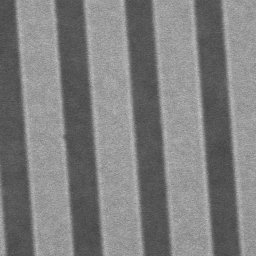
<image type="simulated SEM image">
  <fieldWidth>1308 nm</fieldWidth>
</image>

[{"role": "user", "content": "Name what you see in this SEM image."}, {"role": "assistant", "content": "one or a few lines or trenches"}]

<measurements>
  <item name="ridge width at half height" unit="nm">185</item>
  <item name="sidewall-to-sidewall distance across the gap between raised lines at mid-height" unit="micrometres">0.168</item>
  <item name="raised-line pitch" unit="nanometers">352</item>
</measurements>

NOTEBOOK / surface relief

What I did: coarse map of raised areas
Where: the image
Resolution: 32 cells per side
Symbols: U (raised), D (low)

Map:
DDUUUUUDDDDUUUUDDDDUUUUUDDDDUUUU
DDUUUUUDDDDUUUUDDDDUUUUUDDDDUUUU
DDUUUUUDDDDUUUUDDDDDUUUUDDDDUUUU
DDUUUUUDDDDUUUUDDDDDUUUUDDDDUUUU
DDUUUUUDDDDUUUUUDDDDUUUUDDDDUUUU
DDDUUUUDDDDUUUUUDDDDUUUUDDDDUUUU
DDDUUUUDDDDUUUUUDDDDUUUUDDDDDUUU
DDDUUUUDDDDUUUUUDDDDUUUUUDDDDUUU
DDDUUUUDDDDUUUUUDDDDUUUUUDDDDUUU
DDDUUUUDDDDUUUUUDDDDUUUUUDDDDUUU
DDDUUUUDDDDUUUUUDDDDUUUUUDDDDUUU
DDDUUUUDDDDDUUUUDDDDUUUUUDDDDUUU
DDDUUUUDDDDDUUUUDDDDUUUUUDDDDUUU
DDDUUUUUDDDDUUUUDDDDUUUUUDDDDUUU
DDDUUUUUDDDDUUUUDDDDUUUUUDDDDUUU
DDDUUUUUDDDDUUUUDDDDDUUUUDDDDUUU
DDDDUUUUDDDDUUUUDDDDDUUUUDDDDUUU
DDDDUUUUDDDDUUUUUDDDDUUUUDDDDUUU
DDDDUUUUDDDDUUUUUDDDDUUUUDDDDUUU
DDDDUUUUDDDDUUUUUDDDDUUUUDDDDUUU
DDDDUUUUDDDDUUUUUDDDDUUUUDDDDDUU
DDDDUUUUDDDDUUUUUDDDDUUUUUDDDDUU
DDDDUUUUDDDDUUUUUDDDDUUUUUDDDDUU
DDDDUUUUDDDDUUUUUDDDDUUUUUDDDDUU
DDDDUUUUDDDDDUUUUDDDDUUUUUDDDDUU
DDDDUUUUDDDDDUUUUDDDDUUUUUDDDDUU
DDDDUUUUUDDDDUUUUDDDDUUUUUDDDDUU
DDDDUUUUUDDDDUUUUDDDDUUUUUDDDDUU
DDDDUUUUUDDDDUUUUDDDDDUUUUDDDDUU
DDDDUUUUUDDDDUUUUDDDDDUUUUDDDDUU
DDDDUUUUUDDDDUUUUDDDDDUUUUDDDDUU
DDDDDUUUUDDDDUUUUUDDDDUUUUDDDDUU